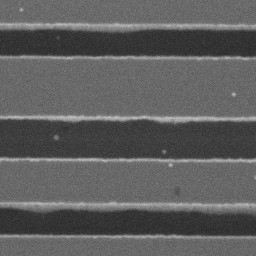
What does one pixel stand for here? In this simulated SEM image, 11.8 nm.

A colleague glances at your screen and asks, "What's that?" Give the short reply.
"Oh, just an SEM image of lines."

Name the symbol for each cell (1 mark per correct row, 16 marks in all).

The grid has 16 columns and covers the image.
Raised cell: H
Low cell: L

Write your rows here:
HHHHHHHHHHHHHHHH
HHHHHHHHHHHHHHHH
LLLLLLLLLLLLLLLL
LLLLLLLLLLLLLLLL
HHHHHHHHHHHHHHHH
HHHHHHHHHHHHHHHH
HHHHHHHHHHHHHHHH
LLLLLLLLLLLLLLLL
LLLLLLLLLLLLLLLL
LLLLLLLLLLLLLLLL
HHHHHHHHHHHHHHHH
HHHHHHHHHHHHHHHH
HHHHHHHHHHHHHHHH
LLLLLLLLLLLLLLLL
LLLLLLLLLLLLLLLL
HHHHHHHHHHHHHHHH